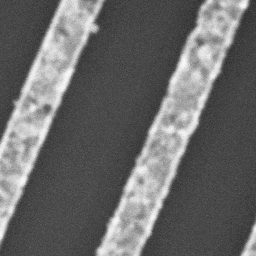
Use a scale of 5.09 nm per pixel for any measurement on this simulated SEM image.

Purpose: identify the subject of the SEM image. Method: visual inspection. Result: one or a few lines or trenches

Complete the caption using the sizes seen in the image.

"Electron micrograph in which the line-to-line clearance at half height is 101 pixels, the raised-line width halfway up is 164 nanometres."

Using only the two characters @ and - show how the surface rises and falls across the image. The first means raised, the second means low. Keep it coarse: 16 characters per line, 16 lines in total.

----@@-------@@-
---@@@-------@@-
---@@-------@@--
---@@-------@@--
--@@-------@@---
--@@-------@@---
-@@-------@@@---
-@@-------@@----
@@@------@@@----
@@-------@@-----
@@-------@@-----
@-------@@------
@-------@@------
-------@@@------
-------@@-------
------@@@-------